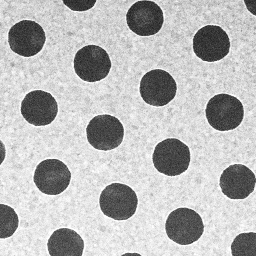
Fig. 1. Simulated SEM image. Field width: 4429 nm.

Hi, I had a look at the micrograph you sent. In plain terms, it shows a regular array of holes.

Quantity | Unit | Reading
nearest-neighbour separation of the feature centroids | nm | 1200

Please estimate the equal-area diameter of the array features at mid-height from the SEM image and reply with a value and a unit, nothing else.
0.66 um